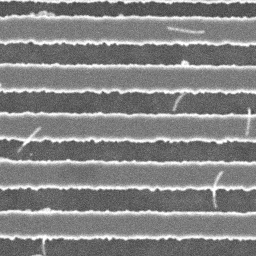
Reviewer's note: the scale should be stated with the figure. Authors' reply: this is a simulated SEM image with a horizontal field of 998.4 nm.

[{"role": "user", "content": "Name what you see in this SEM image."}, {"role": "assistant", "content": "lines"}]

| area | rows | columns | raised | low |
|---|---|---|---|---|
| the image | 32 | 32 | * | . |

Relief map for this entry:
................................
................................
********************************
********************************
********************************
.................*........**.***
................................
................................
********************************
********************************
********************************
.......**...**.*..*.**..*.******
................................
................................
********************************
********************************
********************************
..******************************
................................
................................
********************************
********************************
********************************
*****..*************************
................................
................................
**************.*****..*.........
********************************
********************************
********************************
................................
................................